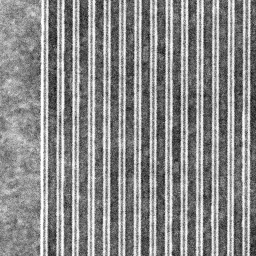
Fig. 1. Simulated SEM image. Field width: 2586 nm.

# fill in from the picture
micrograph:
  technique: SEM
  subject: parallel lines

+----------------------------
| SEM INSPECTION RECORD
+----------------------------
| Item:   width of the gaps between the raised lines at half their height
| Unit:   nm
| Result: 104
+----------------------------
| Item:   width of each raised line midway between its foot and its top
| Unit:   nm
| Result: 51.8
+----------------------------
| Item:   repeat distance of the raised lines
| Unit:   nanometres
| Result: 157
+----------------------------